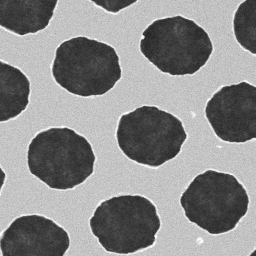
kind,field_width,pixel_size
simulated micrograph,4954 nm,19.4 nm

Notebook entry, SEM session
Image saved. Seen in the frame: holes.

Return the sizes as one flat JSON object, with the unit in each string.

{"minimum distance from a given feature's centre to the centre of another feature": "1790 nm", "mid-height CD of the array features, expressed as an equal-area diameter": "1240 nanometres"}